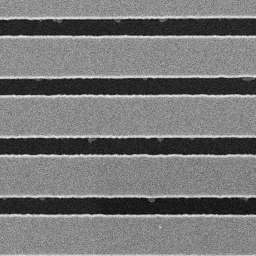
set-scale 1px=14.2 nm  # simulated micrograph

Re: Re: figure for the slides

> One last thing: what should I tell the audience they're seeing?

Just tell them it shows lines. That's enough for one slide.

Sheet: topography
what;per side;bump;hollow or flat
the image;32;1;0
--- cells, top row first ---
11111111111111111111111111111111
11111111111111111111111111111111
00000000000000000000000000000000
00000000000000000000000000000000
00100000000000010000000000100000
11111111111111111111111111111111
11111111111111111111111111111111
11111111111111111111111111111111
11111111111111111111111111111111
11111111111111111111111111111111
00000000000000000000000000000000
00000000000000000000000000000000
11111111111111111111111111111111
11111111111111111111111111111111
11111111111111111111111111111111
11111111111111111111111111111111
11111111111111111111111111111111
00000000000000000000000000000000
00000000000000000000000000000000
11111111111111111111111111111111
11111111111111111111111111111111
11111111111111111111111111111111
11111111111111111111111111111111
11111111111111111111111111111111
11111111111111111111111111111111
00000000000000000000000000000000
00000000000000000000000000000000
11111111111111111111111111111111
11111111111111111111111111111111
11111111111111111111111111111111
11111111111111111111111111111111
11111111111111111111111111111111